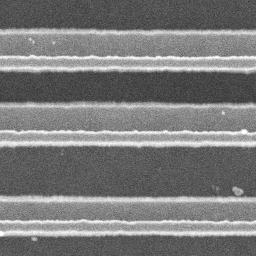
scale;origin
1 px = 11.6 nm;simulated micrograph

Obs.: lines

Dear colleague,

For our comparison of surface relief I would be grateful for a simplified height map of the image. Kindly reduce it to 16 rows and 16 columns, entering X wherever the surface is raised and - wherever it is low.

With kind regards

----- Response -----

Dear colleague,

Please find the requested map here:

----------------
----------------
XXXXXXXXXXXXXXXX
XXXXXXXXXXXXXXXX
----------------
----------------
----------------
XXXXXXXXXXXXXXXX
XXXXXXXXXXXXXXXX
----------------
----------------
----------------
XXXX-XX-XX-X--X-
XXXXXXXXXXXXXXXX
XXXXXXXXXXXXXXXX
----------------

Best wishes